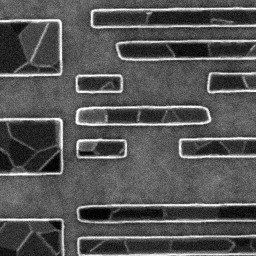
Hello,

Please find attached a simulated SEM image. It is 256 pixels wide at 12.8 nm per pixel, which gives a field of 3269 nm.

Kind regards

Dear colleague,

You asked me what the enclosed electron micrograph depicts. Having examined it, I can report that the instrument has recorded wiring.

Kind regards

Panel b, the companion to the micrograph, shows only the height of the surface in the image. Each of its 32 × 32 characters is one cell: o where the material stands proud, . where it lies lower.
................................
............oooooooooooooooooooo
...........ooooooooooooooooooooo
oooooooo........................
oooooooo........................
oooooooo.......ooooooooooooooooo
oooooooo.......ooooooooooooooooo
oooooooo........................
oooooooo........................
..........ooooo...........oooooo
..........ooooo...........oooooo
...........o..............o.....
................................
...........ooooooooooooooo......
..........oooooooooooooooo......
oooooooo..ooooooooooooo.........
oooooooo........................
oooooooo....o..........ooooooooo
oooooooo..oooooo......oooooooooo
oooooooo..ooooo........ooooooooo
oooooooo........................
oooooooo........................
................................
................................
................................
................................
..........oooooooooooooooooooooo
oooooooo..oooooooooooooooooooooo
oooooooo........................
oooooooo......................oo
oooooooo..oooooooooooooooooooooo
oooooooo..oooooooooooooooooooooo